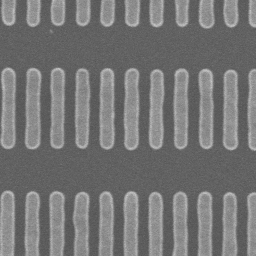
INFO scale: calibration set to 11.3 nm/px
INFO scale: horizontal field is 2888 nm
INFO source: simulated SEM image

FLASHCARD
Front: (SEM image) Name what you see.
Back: groups of lines, slits or small figures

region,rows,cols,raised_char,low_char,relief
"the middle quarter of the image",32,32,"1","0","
00000000000000000000000000000000
00001000001100001100000000000000
00011100011100011100001110001110
00011100011100011100001110001110
00011100011100011100001110001110
00011100011100011100001110001110
00011100011100011100001110001110
00011100011100011100001110001110
00011100011100011100001110001110
00011100011100011110001110001110
00011100011100011110001100001110
00011100011100011110001100001110
00011100011100011100001100001110
00011100011100011100001100001110
00011100011100011100001110001110
00011100011100011100001110001110
00011100011100011100011110001110
00011100011100011100011110001110
00011100011100011100011110001110
00011100011100011100001100001110
00001000011100011100001100001100
00000000000000000000000000000000
00000000000000000000000000000000
00000000000000000000000000000000
00000000000000000000000000000000
00000000000000000000000000000000
00000000000000000000000000000000
00000000000000000000000000000000
00000000000000000000000000000000
00000000000000000000000000000000
00000000000000000000000000000000
00000000000000000000000000000000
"